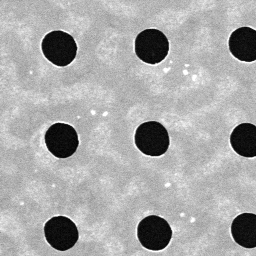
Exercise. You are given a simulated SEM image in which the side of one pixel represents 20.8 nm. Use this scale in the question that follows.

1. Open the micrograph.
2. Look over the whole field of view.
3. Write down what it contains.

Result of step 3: holes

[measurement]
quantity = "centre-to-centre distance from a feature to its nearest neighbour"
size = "1920 nm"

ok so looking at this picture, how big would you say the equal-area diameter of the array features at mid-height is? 734 nm